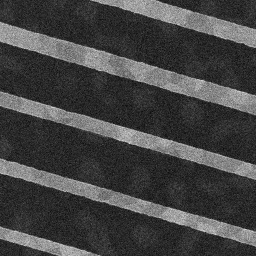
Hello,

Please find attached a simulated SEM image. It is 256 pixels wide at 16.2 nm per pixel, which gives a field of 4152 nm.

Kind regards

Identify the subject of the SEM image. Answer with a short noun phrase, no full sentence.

one or a few lines or trenches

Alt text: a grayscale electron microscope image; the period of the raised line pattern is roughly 64.3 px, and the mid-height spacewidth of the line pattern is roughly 789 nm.